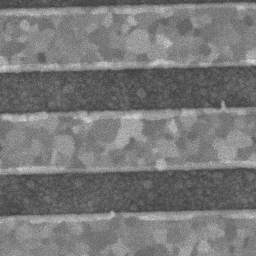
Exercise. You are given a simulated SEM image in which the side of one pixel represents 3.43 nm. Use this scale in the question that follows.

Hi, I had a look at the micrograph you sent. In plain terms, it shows one or a few lines or trenches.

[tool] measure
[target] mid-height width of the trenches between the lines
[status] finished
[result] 154 nm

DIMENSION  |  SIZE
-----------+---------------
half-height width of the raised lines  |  203 nm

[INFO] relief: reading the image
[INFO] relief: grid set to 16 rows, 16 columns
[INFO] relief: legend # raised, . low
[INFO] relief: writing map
......##########
################
################
################
................
................
................
################
################
################
###########.....
................
................
....#.##########
################
################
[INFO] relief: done